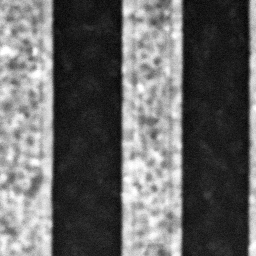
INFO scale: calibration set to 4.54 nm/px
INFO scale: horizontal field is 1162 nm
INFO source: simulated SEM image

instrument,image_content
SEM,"one or a few lines or trenches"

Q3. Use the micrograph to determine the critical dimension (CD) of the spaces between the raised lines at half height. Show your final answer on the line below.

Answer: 359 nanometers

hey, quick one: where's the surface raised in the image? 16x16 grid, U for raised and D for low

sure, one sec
UUUDDDDDUUUDDDDD
UUUDDDDDUUUDDDDD
UUUDDDDDUUUDDDDD
UUUDDDDDUUUDDDDD
UUUDDDDDUUUDDDDD
UUUDDDDDUUUDDDDD
UUUDDDDDUUUDDDDD
UUUDDDDDUUUDDDDD
UUUDDDDDUUUDDDDD
UUUDDDDDUUUDDDDD
UUUDDDDDUUUDDDDD
UUUDDDDDUUUDDDDD
UUUDDDDDUUUDDDDD
UUUDDDDDUUUDDDDD
UUUDDDDDUUUDDDDD
UUUDDDDDUUUDDDDD